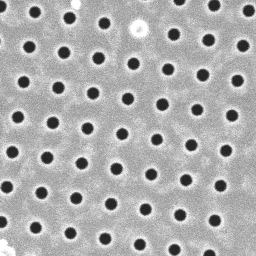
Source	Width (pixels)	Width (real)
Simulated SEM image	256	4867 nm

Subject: a regular array of holes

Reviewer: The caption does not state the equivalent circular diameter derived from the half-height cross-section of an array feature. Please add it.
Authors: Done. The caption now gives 247 nm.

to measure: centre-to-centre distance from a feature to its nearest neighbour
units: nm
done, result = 666